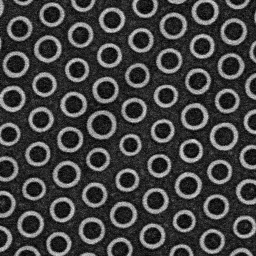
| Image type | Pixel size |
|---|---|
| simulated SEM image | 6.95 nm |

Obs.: a regular array of ring-shaped raised bodies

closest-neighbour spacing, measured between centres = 246 nm